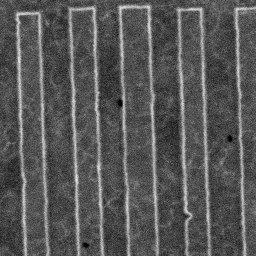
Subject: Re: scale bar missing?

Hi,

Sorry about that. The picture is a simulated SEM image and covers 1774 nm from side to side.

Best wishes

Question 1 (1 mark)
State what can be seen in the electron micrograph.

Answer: parallel lines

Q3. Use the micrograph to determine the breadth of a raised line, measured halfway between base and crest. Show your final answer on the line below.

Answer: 160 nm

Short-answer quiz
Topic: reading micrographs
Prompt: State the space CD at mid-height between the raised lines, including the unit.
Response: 209 nm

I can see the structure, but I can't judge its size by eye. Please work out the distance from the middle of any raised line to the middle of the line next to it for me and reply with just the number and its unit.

54 px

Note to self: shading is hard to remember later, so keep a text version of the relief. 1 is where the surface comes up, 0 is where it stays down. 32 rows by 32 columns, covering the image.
00000000000000000000000000000000
00000000011100011110001110000011
00111000011100011110001110000111
00111000011100011110001110000011
00111000011100011110001110000011
00111000011100011110001110000011
00111000011100011110000110000011
00111000011100011110001110000011
00111000011100011110000110000011
00111000011100011110000110000011
00111000011100011110000110000011
00011000011100011110000110000011
00011000011100011110000111000011
00011000011100011110000111000011
00011000011100011110000111000011
00011000011100011110000111000011
00011000011100011110000111000011
00011000011100001110000111000011
00011000011100001110000111000011
00011000011100001110000111000011
00011100011100001110000111000011
00011100001100001110000111000011
00011100001100001110000111000011
00011100001110001110000111000011
00011100001110001110000111000011
00011100001110001110000111000011
00011100001110001110000111000011
00011100001110001110000111000011
00011100001110001111000111000011
00011100001110001111000111000011
00011100001110001111000111000001
00011100001110001111000111000001